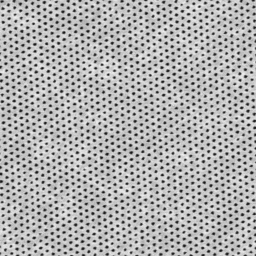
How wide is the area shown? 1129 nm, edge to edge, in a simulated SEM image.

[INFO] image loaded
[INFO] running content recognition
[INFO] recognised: a regular array of holes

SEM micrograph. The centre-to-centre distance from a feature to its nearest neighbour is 28.7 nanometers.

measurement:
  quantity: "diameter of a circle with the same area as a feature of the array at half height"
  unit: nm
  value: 14.1